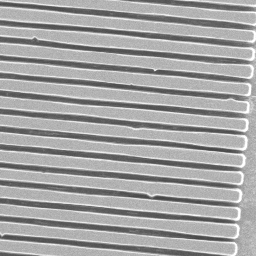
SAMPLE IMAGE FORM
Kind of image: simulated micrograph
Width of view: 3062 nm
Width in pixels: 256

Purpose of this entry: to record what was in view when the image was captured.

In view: parallel lines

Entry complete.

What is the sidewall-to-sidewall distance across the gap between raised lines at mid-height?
0.067 microns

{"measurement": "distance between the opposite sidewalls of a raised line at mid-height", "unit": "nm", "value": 147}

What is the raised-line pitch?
213 nm